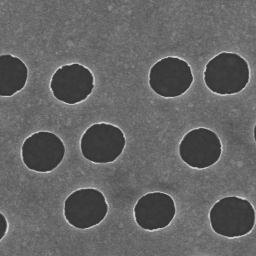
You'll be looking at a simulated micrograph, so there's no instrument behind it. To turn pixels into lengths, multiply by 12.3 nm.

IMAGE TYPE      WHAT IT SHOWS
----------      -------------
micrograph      a regular array of holes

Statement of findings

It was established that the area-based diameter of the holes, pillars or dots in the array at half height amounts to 505 nanometres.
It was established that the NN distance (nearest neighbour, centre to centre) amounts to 820 nm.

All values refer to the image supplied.